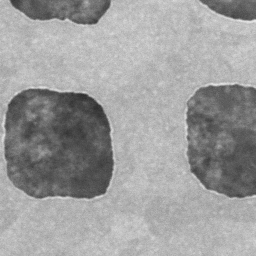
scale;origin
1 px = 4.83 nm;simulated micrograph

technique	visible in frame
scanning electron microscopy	holes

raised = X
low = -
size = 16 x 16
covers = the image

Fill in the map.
X------XXXXXX---
XXXXX-XXXXXXXXXX
XXXXXXXXXXXXXXXX
XXXXXXXXXXXXXXXX
XXXXXXXXXXXXXXXX
XX-XXXXXXXXXX---
X-----XXXXXX----
-------XXXXX----
-------XXXXX----
-------XXXXX----
-------XXXXX----
X------XXXXXX---
XXXXXXXXXXXXXXXX
XXXXXXXXXXXXXXXX
XXXXXXXXXXXXXXXX
XXXXXXXXXXXXXXXX